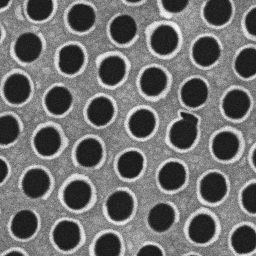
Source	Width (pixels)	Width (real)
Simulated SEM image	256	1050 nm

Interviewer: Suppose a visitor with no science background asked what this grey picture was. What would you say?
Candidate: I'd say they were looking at a regular array of holes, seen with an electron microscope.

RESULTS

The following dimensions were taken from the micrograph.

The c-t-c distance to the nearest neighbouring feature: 42.7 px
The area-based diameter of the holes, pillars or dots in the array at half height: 110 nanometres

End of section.